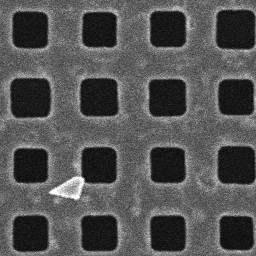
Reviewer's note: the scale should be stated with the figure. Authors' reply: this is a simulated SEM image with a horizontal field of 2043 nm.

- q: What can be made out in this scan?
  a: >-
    a regular array of holes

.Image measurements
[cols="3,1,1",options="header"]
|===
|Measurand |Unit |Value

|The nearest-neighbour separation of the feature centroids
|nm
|542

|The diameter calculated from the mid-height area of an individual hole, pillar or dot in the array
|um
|0.322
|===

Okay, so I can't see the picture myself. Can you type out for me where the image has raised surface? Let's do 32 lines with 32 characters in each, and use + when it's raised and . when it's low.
++++++++++++++++++++++++++++++++
++...++++++...+++++....++++.....
++....++++.....++++....++++.....
+.....++++.....++++....++++.....
+.....++++.....++++....++++.....
++....++++....+++++....++++.....
++++++++++++++++++++++++++++++++
++++++++++++++++++++++++++++++++
++++++++++++++++++++++++++++++++
++++++++++++++++++++++++++++++++
+.....++++.....++++....++++.....
+.....++++.....++++....++++.....
+.....++++.....++++....++++.....
+.....++++.....++++....++++.....
++....+++++...+++++....+++++...+
++++++++++++++++++++++++++++++++
++++++++++++++++++++++++++++++++
++++++++++++++++++++++++++++++++
+++..++++++...+++++....+++++...+
++....++++.....++++....++++.....
++....++++.....++++....++++.....
++....++++.....++++....++++.....
++....++++....+++++....++++.....
++++++++++++++++++++++++++++++++
++++++++++++++++++++++++++++++++
++++++++++++++++++++++++++++++++
++++++++++++++++++++++++++++++++
++....++++.....++++....++++.....
+.....++++.....++++....++++.....
+.....++++.....++++....++++.....
++....++++.....++++....++++.....
+++.+++++++.++++++++..++++++++++